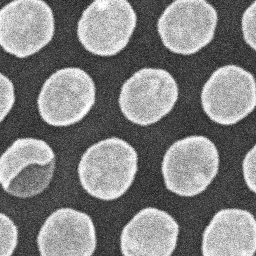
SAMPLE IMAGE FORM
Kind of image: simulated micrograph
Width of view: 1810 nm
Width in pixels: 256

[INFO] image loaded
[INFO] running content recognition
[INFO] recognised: raised bodies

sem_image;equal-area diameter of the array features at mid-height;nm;398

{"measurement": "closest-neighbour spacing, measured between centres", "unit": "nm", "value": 577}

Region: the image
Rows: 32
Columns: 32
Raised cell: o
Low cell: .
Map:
.ooooo.....ooooo......oooo......
oooooo.....oooooo....oooooo....o
ooooooo...ooooooo...ooooooo...oo
ooooooo...ooooooo...ooooooo...oo
oooooo....oooooo....ooooooo....o
oooooo....oooooo.....ooooo.....o
.ooo.......oooo.......oo........
................................
............................oo..
......ooooo......oooo......oooo.
o.....oooooo....oooooo....oooooo
oo...ooooooo...ooooooo...ooooooo
oo...ooooooo...ooooooo...ooooooo
o....oooooo....oooooo....ooooooo
o....ooooo......oooo......ooooo.
.......o........................
................................
..oo.........oo........ooo......
.ooooo.....ooooo.....oooooo.....
ooooooo...ooooooo....oooooo....o
oooo......ooooooo...ooooooo....o
oo........ooooooo...ooooooo....o
o.........oooooo.....ooooo.....o
...........ooooo.....ooooo.....o
............ooo.................
................................
.......ooo........oo........ooo.
o.....ooooo......ooooo.....ooooo
oo...ooooooo....oooooo....oooooo
oo...ooooooo...ooooooo....oooooo
oo...ooooooo...ooooooo...ooooooo
oo...ooooooo...oooooo....ooooooo